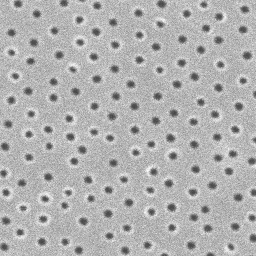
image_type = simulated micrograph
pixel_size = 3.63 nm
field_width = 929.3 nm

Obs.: a regular array of holes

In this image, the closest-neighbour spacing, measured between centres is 0.072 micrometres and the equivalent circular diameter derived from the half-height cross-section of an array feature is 8.6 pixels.